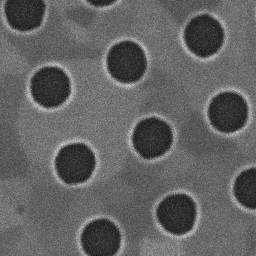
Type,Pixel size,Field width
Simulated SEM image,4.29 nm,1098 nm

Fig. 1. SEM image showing holes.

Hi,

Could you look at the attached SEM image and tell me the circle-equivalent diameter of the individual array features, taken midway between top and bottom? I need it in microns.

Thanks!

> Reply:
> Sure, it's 0.185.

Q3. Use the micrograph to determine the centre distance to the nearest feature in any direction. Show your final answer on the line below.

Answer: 342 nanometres